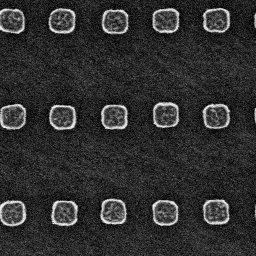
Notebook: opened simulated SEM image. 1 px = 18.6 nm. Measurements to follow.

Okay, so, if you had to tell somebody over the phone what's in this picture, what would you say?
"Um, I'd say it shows a regular array of raised bodies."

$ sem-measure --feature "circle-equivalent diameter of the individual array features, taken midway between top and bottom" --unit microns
0.469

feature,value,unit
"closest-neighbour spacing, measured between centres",938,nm